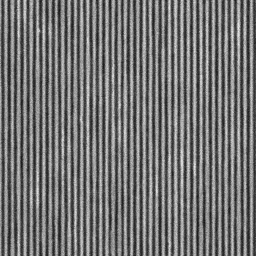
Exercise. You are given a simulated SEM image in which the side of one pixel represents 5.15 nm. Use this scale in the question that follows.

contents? parallel lines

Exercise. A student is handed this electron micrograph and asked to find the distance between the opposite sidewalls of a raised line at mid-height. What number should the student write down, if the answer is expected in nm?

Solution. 14.2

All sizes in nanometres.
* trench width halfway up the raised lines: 19.3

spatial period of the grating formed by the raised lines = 32.4 nanometres